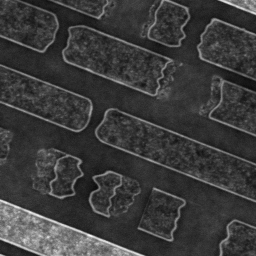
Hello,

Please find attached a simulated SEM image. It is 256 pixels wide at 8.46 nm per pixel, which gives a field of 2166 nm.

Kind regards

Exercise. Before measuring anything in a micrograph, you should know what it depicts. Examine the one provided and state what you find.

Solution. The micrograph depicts one or a few lines or trenches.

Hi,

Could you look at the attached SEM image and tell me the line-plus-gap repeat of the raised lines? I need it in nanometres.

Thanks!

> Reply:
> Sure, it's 520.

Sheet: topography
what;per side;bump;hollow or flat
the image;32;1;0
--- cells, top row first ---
11100000111110000000110000000111
11111100001110000000111000000000
11111110000000000001111000000000
11111110011000000001111000111100
11111110011111000001111001111111
00011100011111110000010001111111
00000000111111111110000001111111
00000000111111111111100000111111
10000000001111111111100000001111
11110000000001111111000000000001
11111100000000001111000000001000
11111111100000000011000000001111
11111111111000000000000000001111
00111111111000000000000000011111
00000111111001110000000000111111
00000001111001111110000000001111
00000000000011111111110000000001
00000000000001111111111100000000
00000000000000011111111111100000
00000000000000000111111111111000
00000001110000000000111111111111
00000001110000000000000111111111
00000001100011100000000001111111
00000011100011100000000000001111
00000001000111000001100000000011
10000000000111000011111000000000
11110000000011000011110000000000
11111100000000000011110000000000
11111111100000000011110000000111
11111111111000000000110000001111
00111111111111000000000000001111
00001111111111110000000000001111